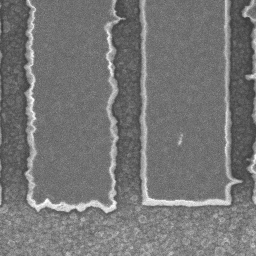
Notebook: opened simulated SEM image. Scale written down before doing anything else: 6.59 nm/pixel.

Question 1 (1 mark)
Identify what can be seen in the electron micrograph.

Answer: one or a few lines or trenches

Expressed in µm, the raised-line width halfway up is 0.564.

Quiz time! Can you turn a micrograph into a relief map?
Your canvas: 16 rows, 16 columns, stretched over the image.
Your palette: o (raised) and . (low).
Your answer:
..ooooo..ooooo.o
..ooooo..ooooo..
..ooooo..ooooo..
..ooooo..ooooo..
..ooooo..ooooo..
..ooooo..ooooo..
..ooooo..ooooo..
..ooooo..ooooo..
..ooooo..ooooo..
..ooooo..ooooo..
..ooooo..ooooo..
..ooooo..oooooo.
..ooooo..ooooo..
................
................
................